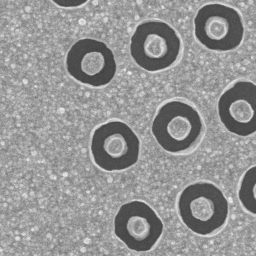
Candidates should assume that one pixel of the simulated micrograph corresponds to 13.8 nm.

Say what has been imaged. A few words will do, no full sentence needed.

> ring-shaped grooves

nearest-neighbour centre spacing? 910 nm